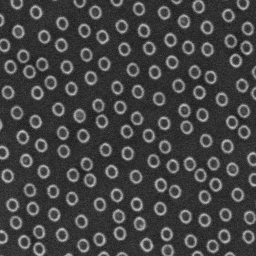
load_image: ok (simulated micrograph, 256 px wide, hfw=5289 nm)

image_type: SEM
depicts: a regular array of raised bodies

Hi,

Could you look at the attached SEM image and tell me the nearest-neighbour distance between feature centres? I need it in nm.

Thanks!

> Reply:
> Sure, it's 400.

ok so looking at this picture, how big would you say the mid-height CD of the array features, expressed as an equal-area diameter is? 0.228 microns